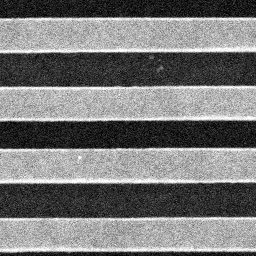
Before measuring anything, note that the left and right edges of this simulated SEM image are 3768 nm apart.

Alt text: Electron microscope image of lines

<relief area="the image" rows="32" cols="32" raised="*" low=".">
................................
................................
********************************
********************************
********************************
********************************
******.**.......................
................................
................................
................................
................................
********************************
********************************
********************************
********************************
................................
................................
................................
................................
********************************
********************************
********************************
********************************
................................
................................
................................
................................
********************************
********************************
********************************
********************************
***.............................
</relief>